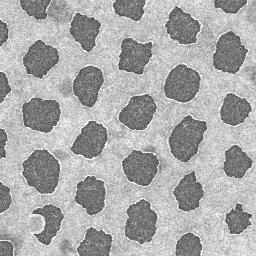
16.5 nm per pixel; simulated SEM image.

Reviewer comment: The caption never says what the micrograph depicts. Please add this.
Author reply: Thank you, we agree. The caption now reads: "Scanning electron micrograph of a regular array of holes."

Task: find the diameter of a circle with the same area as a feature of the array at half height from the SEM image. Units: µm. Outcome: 0.577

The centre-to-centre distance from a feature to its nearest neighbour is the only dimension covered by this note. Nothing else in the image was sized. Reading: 891 nm